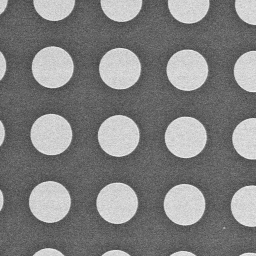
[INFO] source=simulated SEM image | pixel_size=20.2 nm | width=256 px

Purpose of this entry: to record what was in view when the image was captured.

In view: an array of small figures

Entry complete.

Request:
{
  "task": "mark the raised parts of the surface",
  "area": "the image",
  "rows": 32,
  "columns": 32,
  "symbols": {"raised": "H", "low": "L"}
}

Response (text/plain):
HLLLHHHHHLLLLHHHHHLLLHHHHHLLLHHH
LLLLLHHHHLLLLHHHHLLLLHHHHHLLLLHH
LLLLLLHLLLLLLLHHLLLLLLHHHLLLLLHH
LLLLLLLLLLLLLLLLLLLLLLLLLLLLLLLL
LLLLLLLLLLLLLLLLLLLLLLLLLLLLLLLL
LLLLLLLLLLLLLLLLLLLLLLLLLLLLLLLL
LLLLLHHHLLLLLLHHLLLLLLHHLLLLLLLH
HLLLHHHHHLLLLHHHHLLLLHHHHHLLLLHH
HLLLHHHHHLLLHHHHHLLLLHHHHHLLLHHH
LLLLHHHHHLLLLHHHHLLLLHHHHHLLLHHH
LLLLLHHHLLLLLHHHHLLLLLHHHLLLLLHH
LLLLLLLLLLLLLLLLLLLLLLLLLLLLLLLL
LLLLLLLLLLLLLLLLLLLLLLLLLLLLLLLL
LLLLLLLLLLLLLLLLLLLLLLLLLLLLLLLL
LLLLLHHLLLLLLLHLLLLLLLLLLLLLLLLL
LLLLHHHHHLLLLHHHHLLLLHHHHLLLLLHH
HLLLHHHHHLLLHHHHHLLLLHHHHHLLLHHH
LLLLHHHHHLLLHHHHHLLLLHHHHHLLLHHH
LLLLLHHHLLLLLHHHHLLLLHHHHLLLLHHH
LLLLLLLLLLLLLLLLLLLLLLHHLLLLLLHH
LLLLLLLLLLLLLLLLLLLLLLLLLLLLLLLL
LLLLLLLLLLLLLLLLLLLLLLLLLLLLLLLL
LLLLLLLLLLLLLLLLLLLLLLLLLLLLLLLL
LLLLHHHHLLLLLHHHLLLLLLHHLLLLLLHH
LLLLHHHHHLLLHHHHHLLLLHHHHLLLLHHH
LLLLHHHHHLLLHHHHHLLLLHHHHHLLLHHH
LLLLHHHHLLLLHHHHHLLLLHHHHLLLLHHH
LLLLLHHLLLLLLHHHLLLLLHHHHLLLLLHH
LLLLLLLLLLLLLLLLLLLLLLLLLLLLLLLL
LLLLLLLLLLLLLLLLLLLLLLLLLLLLLLLL
LLLLLLLLLLLLLLLLLLLLLLLLLLLLLLLL
LLLLLHHLLLLLLHHLLLLLLLHLLLLLLLLL